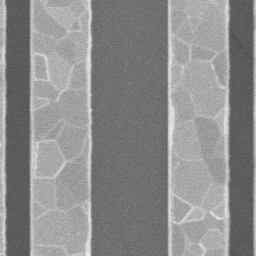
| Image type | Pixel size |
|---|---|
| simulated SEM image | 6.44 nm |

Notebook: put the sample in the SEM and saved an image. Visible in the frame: lines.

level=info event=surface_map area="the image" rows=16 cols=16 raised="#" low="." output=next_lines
..####.....###..
..####.....###..
..####.....###..
..####.....###..
..####.....###..
..####.....###..
..####.....###..
..####.....###..
..####.....###..
..####.....###..
..####.....###..
..####.....###..
..####.....###..
..####.....###..
..####.....###..
..####.....###..